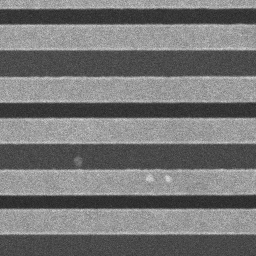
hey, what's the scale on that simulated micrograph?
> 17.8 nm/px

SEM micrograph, lines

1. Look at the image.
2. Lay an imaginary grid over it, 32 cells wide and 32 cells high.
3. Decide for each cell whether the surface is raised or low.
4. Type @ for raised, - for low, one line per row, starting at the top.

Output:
@@@@@@@@@@@@@@@@@@@@@@@@@@@@@@@@
--------------------------------
--------------------------------
@@@@@@@@@@@@@@@@@@@@@@@@@@@@@@@@
@@@@@@@@@@@@@@@@@@@@@@@@@@@@@@@@
@@@@@@@@@@@@@@@@@@@@@@@@@@@@@@@@
--------------------------------
--------------------------------
--------------------------------
--------------------------------
@@@@@@@@@@@@@@@@@@@@@@@@@@@@@@@@
@@@@@@@@@@@@@@@@@@@@@@@@@@@@@@@@
@@@@@@@@@@@@@@@@@@@@@@@@@@@@@@@@
--------------------------------
--------------------------------
@@@@@@@@@@@@@@@@@@@@@@@@@@@@@@@@
@@@@@@@@@@@@@@@@@@@@@@@@@@@@@@@@
@@@@@@@@@@@@@@@@@@@@@@@@@@@@@@@@
--------------------------------
--------------------------------
--------------------------------
@@@@@@@@@@@@@@@@@@@@@@@@@@@@@@@@
@@@@@@@@@@@@@@@@@@@@@@@@@@@@@@@@
@@@@@@@@@@@@@@@@@@@@@@@@@@@@@@@@
--------------------------------
--------------------------------
@@@@@@@@@@@@@@@@@@@@@@@@@@@@@@@@
@@@@@@@@@@@@@@@@@@@@@@@@@@@@@@@@
@@@@@@@@@@@@@@@@@@@@@@@@@@@@@@@@
--------------------------------
--------------------------------
--------------------------------